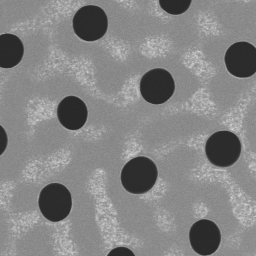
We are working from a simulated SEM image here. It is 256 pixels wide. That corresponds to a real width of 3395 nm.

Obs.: holes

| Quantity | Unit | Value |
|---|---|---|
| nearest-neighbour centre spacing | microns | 1.17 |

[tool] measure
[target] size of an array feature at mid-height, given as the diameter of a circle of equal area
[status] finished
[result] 475 nm